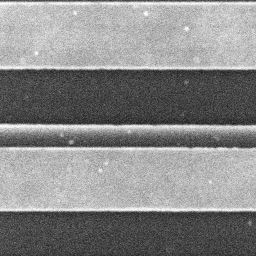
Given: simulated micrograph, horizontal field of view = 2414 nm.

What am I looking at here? lines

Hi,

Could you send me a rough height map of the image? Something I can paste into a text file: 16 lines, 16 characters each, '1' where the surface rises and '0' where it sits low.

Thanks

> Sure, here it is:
1111111111111111
1111111111111111
1111111111111111
1111111111111111
0000000000000000
0000000000000000
0000000000000000
0000000000000000
1111111111111111
1111111111111111
1111111111111111
1111111111111111
1111111111111111
0000000000000000
0000000000000000
0000000000000000